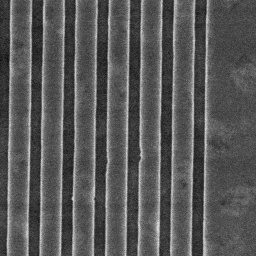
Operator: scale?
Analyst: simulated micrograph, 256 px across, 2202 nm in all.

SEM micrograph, parallel lines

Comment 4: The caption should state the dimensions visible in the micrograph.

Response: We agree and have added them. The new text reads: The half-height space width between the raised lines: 0.104 µm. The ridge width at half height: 177 nm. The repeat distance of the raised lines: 0.28 microns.